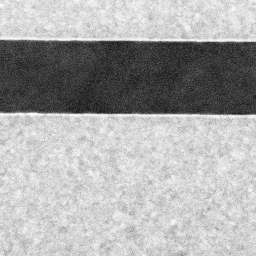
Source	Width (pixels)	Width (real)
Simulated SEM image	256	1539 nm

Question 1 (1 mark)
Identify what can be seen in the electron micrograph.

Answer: wiring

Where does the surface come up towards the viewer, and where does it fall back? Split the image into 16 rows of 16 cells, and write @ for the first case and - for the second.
@@@@@@@@@@@@@@@@
@@@@@@@@@@@@@@@@
------------@@@@
----------------
----------------
----------------
----------------
@@@@@@@@@@@@@@@@
@@@@@@@@@@@@@@@@
@@@@@@@@@@@@@@@@
@@@@@@@@@@@@@@@@
@@@@@@@@@@@@@@@@
@@@@@@@@@@@@@@@@
@@@@@@@@@@@@@@@@
@@@@@@@@@@@@@@@@
@@@@@@@@@@@@@@@@